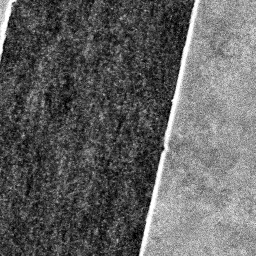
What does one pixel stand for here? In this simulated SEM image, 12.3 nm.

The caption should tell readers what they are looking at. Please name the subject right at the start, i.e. one or a few lines or trenches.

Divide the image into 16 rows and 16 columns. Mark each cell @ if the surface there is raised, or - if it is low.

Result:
@-----------@@@@
------------@@@@
------------@@@@
------------@@@@
-----------@@@@@
-----------@@@@@
-----------@@@@@
-----------@@@@@
----------@@@@@@
----------@@@@@@
----------@@@@@@
----------@@@@@@
----------@@@@@@
---------@@@@@@@
---------@@@@@@@
---------@@@@@@@